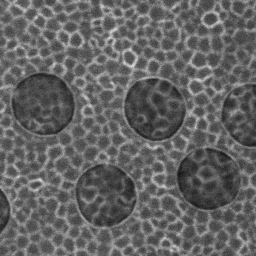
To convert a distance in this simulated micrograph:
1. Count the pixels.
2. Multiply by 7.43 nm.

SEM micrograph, holes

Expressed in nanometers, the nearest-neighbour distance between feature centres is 697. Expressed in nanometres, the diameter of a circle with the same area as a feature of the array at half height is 470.